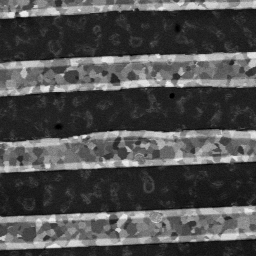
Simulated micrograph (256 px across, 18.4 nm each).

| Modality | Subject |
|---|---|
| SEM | one or a few lines or trenches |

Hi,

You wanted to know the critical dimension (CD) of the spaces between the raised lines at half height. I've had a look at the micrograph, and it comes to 946 nanometres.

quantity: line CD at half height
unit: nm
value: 472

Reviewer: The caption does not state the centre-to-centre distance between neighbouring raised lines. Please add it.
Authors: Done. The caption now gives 1420 nm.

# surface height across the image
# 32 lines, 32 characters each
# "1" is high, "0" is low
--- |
11111111111111111111111111111110
11111000000000000000000000000000
00000000000000000000000000000000
00000000000000000000000000000000
00000000000000000000000000000000
00000000000000000000000000000000
00000000000000000000000000000000
00000000000000011111111111111111
11111111111111111111111111111111
11111111111111111111111111111111
11111111111111110000000000000000
10000000000000000000000000000000
00000000000000000000000000000000
00000000000000000000000000000000
00000000000000000000000000000000
00000000000000000000000000000000
00000000000000000000000000000000
00000000001111111111111111111111
11111111111111111111111111111111
11111111111111111111111111111111
11111111111111000100000000000000
00000000000000000000000000000000
00000000000000000000000000000000
00000000000000000000000000000000
00000000000000000000000000000000
00000000000000000000000000000000
00000000000000000001000000111111
11011111111111111111111111111111
11111111111111111111111111111111
11111111111111111111111111111000
11111100000000000000000000000000
00000000000000000000000000000000